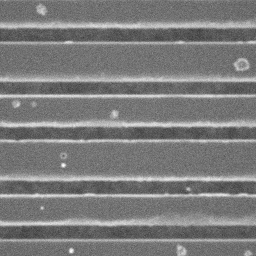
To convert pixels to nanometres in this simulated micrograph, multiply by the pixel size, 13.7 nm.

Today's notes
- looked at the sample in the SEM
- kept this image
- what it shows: lines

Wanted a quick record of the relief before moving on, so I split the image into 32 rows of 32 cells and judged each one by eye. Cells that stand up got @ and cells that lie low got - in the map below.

@@@@@@@@@@@@@@@@@@@@@@@@@@@@@@@@
@@@@@@@@@@@@@@@@@@@@@@@@@@@@@@@@
@@@@@@@@@@@@@@@@@@@@@@@@@@@@@@@@
--------------------------------
--------------------------------
@@@@@@@@@@@@@@@@@@@@@@@@@@@@@@@@
@@@@@@@@@@@@@@@@@@@@@@@@@@@@@@@@
@@@@@@@@@@@@@@@@@@@@@@@@@@@@@@@@
@@@@@@@@@@@@@@@@@@@@@@@@@@@@@@@@
@@@@@@@@@@@@@@@@@@@@@@@@@@@@@@@@
--------------------------------
--------------------------------
@@@@@@@@@@@@@@@@@@@@@@@@@@@@@@@@
@@@@@@@@@@@@@@@@@@@@@@@@@@@@@@@@
@@@@@@@@@@@@@@@@@@@@@@@@@@@@@@@@
@@@@@@@@@@@--@@@@@@@@@@@@@@@@@--
--------------------------------
--------------------------------
@@@@@@@@@@@@@@@@@@@@@@@@@@@@@@@@
@@@@@@@@@@@@@@@@@@@@@@@@@@@@@@@@
@@@@@@@@@@@@@@@@@@@@@@@@@@@@@@@@
@@@@@@@@@@@@@@@@@@@@@@@@@@@@@@@@
--------------------------------
--------------------------------
@@@@@@@@@@@@@@@@@@@@@@@@@@@@@@@@
@@@@@@@@@@@@@@@@@@@@@@@@@@@@@@@@
@@@@@@@@@@@@@@@@@@@@@@@@@@@@@@@@
@@@@@@@@@@@@@@@@@@@@@@@@@@@@@@@@
--------------------------------
--------------------------------
@@@@@@@@@@@@@@@@@@@@@@@@@@@@@@@@
@@@@@@@@@@@@@@@@@@@@@@@@@@@@@@@@